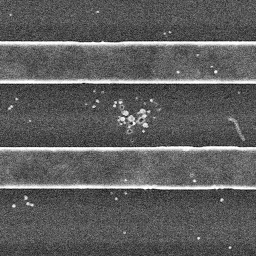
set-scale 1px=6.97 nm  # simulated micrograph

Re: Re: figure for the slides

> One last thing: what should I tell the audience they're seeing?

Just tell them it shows lines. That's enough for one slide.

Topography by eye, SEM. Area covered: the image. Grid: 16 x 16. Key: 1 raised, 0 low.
0000000000000000
0000000000000000
0000000000000000
1111111111111111
1111111111111111
0000000000000000
0000000000000000
0000000000000000
0000000000000000
1111111111111111
1111111111111111
1111111111111111
0000000000000000
0000000000000000
0000000000000000
0000000000000000